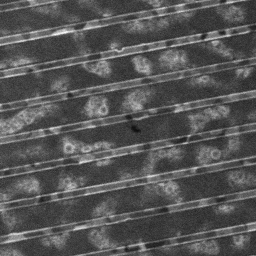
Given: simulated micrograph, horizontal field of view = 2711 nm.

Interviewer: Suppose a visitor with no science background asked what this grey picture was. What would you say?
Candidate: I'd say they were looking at parallel lines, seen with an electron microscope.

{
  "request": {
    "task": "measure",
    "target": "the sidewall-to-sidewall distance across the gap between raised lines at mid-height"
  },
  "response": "271 nm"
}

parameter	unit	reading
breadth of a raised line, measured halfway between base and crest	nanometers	71.6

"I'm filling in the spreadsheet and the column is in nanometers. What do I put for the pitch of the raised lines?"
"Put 345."